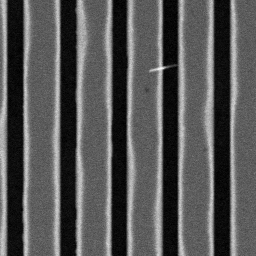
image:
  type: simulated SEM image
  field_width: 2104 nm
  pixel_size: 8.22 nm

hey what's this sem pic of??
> lines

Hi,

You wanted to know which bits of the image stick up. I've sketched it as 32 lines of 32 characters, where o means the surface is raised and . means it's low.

o..oooo...oooo..oooo..ooooo..ooo
o..oooo...oooo..oooo..ooooo..ooo
o..oooo...oooo..oooo..ooooo..ooo
o..oooo...oooo..oooo..ooooo..ooo
o..oooo...oooo..oooo..ooooo..ooo
o..oooo...oooo..oooo..ooooo..ooo
o..oooo...oooo..oooo..ooooo..ooo
o..oooo...oooo..oooo..ooooo..ooo
o..oooo...oooo..oooo..ooooo..ooo
o..oooo...oooo..oooo..ooooo..ooo
o..oooo...oooo..oooo..ooooo..ooo
o..oooo...oooo..oooo..ooooo..ooo
o..oooo...oooo..oooo..ooooo..ooo
o..oooo...oooo..oooo..ooooo..ooo
o..oooo...oooo..oooo..ooooo..ooo
o..oooo...oooo..oooo..ooooo..ooo
o..oooo...oooo..oooo..ooooo..ooo
o..oooo...oooo..oooo..ooooo..ooo
o..oooo...oooo..oooo..ooooo..ooo
o..oooo...oooo..oooo..ooooo..ooo
o..oooo...oooo..oooo..ooooo..ooo
o..oooo...oooo..oooo..ooooo..ooo
o..oooo...oooo..oooo..ooooo..ooo
o..oooo...oooo..oooo..ooooo..ooo
o..oooo...oooo..oooo..ooooo..ooo
o..oooo...oooo..oooo..ooooo..ooo
o..oooo...oooo..oooo..ooooo..ooo
o..oooo...oooo..oooo..ooooo..ooo
o..oooo...oooo..oooo..ooooo..ooo
o..oooo...oooo..oooo..ooooo..ooo
o..oooo...oooo..oooo..ooooo..ooo
o..oooo...oooo..oooo..ooooo..ooo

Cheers